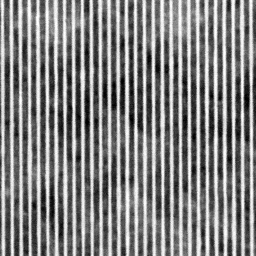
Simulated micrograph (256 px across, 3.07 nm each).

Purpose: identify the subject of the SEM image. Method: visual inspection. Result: parallel lines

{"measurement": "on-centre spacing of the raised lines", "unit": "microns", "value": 0.0272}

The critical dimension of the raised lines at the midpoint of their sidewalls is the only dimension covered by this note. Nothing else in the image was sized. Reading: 6.5 nanometres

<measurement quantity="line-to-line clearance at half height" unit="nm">21.1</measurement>